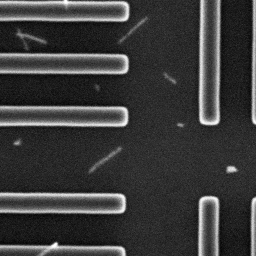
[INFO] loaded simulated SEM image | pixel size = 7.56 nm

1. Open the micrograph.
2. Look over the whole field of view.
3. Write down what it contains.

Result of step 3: groups of lines, slits or small figures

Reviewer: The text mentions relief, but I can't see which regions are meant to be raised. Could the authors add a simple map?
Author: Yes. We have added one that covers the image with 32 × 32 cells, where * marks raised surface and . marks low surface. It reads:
****************.........**.....
****************.........**.....
..............*..........**.....
.........................**.....
.........................**.....
.........................**.....
.........................**.....
****************.........**.....
****************.........**.....
.........................**.....
.........................**.....
.........................**.....
.........................**.....
***************..........**.....
****************.........**.....
**.....********.................
................................
................................
................................
................................
................................
................................
................................
................................
***************.................
***************..........**.....
.........................**.....
.........................**.....
.........................**.....
.........................**.....
.........................**.....
***************..........**.....